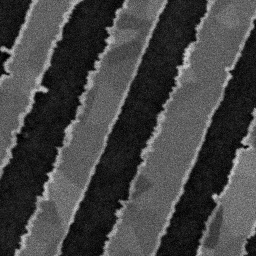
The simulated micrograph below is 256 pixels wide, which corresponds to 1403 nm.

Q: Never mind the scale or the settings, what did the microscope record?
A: one or a few lines or trenches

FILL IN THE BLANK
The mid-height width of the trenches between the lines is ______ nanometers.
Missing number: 224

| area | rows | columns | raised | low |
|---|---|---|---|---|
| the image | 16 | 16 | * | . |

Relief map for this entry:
..***...**...***
..**...***...***
.***...**...***.
.**...***...***.
***...**...***..
**...***...***..
**...***..****..
*....**...***...
*...***...***..*
*...**...***...*
...***...***...*
...***..****..**
...**...***...**
..***..****..***
..**...***...***
.***...***..***.